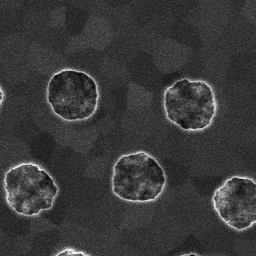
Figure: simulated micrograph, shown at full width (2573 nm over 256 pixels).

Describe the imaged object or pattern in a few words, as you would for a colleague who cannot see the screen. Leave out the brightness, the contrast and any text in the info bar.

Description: holes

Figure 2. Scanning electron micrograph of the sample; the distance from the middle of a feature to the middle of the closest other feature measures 974 nm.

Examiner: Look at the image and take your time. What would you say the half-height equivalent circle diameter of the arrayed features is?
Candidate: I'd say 499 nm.